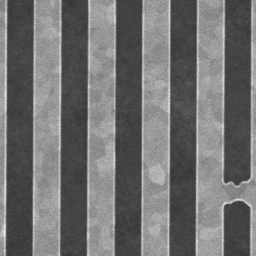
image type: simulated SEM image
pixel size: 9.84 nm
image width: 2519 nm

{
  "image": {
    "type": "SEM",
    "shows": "parallel lines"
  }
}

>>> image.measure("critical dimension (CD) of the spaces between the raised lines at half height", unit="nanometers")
280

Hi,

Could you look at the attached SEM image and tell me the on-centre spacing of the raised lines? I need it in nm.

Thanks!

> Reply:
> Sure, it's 536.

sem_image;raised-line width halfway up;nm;255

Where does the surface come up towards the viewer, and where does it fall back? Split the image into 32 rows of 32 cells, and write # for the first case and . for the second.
#...####...###....###....###....
#...####...###....###....###....
#...####...###....###....###....
#...###....###....###....###....
#...###....###....###....###....
#...###....###....###....###....
#...###....###....###....###....
#...###....###....###....###....
#...###....###....###....###....
#...###....###....###....###....
#...###....###....###....###....
#...###....###....###....###....
#...###....###....###....###....
#...###....###....###....###....
#...###....###....###....###....
#...###....###....###....###....
#...###....###....###....###....
#...###....###....###....###....
#...###....###....###....###....
#...###....###....###....###....
#...###....###....###....###....
#...###....###....###....###....
#...###....###....###....###...#
#...###....###....###....#######
#...###....###....###....#######
#...###....###....###....###...#
#...###....###....###....###...#
#...###....###....###....###...#
#...###....###....###....###...#
#...###....###....###....###...#
#...###....###....###....###...#
#...###....###....###....###...#